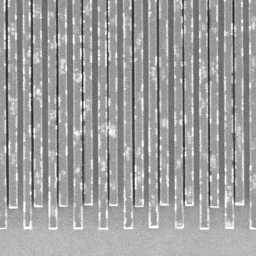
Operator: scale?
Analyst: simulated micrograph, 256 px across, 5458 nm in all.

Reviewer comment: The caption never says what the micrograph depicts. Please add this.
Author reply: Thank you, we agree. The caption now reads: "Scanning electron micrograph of parallel lines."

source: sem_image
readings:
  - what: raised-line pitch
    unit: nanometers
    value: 268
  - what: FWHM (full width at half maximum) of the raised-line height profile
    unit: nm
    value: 178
